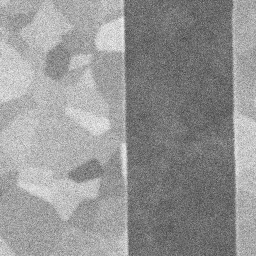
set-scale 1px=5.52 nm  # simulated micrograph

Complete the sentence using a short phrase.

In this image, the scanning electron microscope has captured one or a few lines or trenches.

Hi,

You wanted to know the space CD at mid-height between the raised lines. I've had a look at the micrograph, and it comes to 110 pixels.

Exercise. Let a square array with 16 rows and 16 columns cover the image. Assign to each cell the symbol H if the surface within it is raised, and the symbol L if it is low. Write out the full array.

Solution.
HHHHHHHHLLLLLLLH
HHHHHHHHLLLLLLLH
HHHHHHHHLLLLLLLH
HHHHHHHHLLLLLLLH
HHHHHHHHLLLLLLLH
HHHHHHHHLLLLLLLH
HHHHHHHHLLLLLLLH
HHHHHHHHLLLLLLLH
HHHHHHHHLLLLLLLH
HHHHHHHHLLLLLLLH
HHHHHHHHLLLLLLLH
HHHHHHHHLLLLLLLH
HHHHHHHHLLLLLLLH
HHHHHHHHLLLLLLLH
HHHHHHHHLLLLLLLH
HHHHHHHHLLLLLLLH